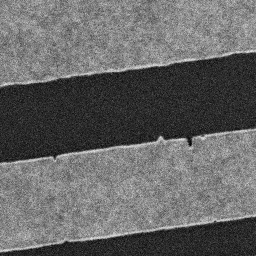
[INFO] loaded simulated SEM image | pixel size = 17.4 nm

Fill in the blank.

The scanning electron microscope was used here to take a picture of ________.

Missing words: one or a few lines or trenches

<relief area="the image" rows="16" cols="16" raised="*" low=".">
****************
****************
****************
**************..
******..........
................
................
................
.............***
.....***********
****************
****************
****************
****************
*********.......
**..............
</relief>